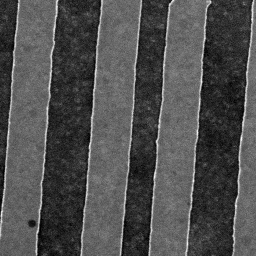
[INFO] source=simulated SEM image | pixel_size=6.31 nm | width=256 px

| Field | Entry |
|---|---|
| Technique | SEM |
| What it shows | one or a few lines or trenches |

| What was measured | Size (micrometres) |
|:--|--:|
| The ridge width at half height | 0.248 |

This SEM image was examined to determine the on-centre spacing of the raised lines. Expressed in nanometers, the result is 468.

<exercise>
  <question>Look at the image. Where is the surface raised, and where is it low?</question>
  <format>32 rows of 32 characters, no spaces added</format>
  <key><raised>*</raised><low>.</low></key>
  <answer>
..*****......*****...*****......
..*****......*****...*****......
..*****......****....*****......
..*****.....*****....*****.....*
..*****.....*****....*****.....*
..*****.....*****....****......*
..*****.....*****....****......*
..****......*****....****......*
..****......*****...*****......*
..****......*****...*****......*
.*****......*****...*****......*
.*****......*****...*****......*
.*****......*****...*****......*
.*****......*****...*****......*
.*****.....******...*****......*
.*****.....*****....*****.....**
.*****.....*****....*****.....**
.*****.....*****....*****.....**
.*****.....*****....****......**
.*****.....*****....****......**
.****......*****....****......**
.****......*****...*****......**
.****......*****...*****......**
.****......*****...*****......**
*****......*****...*****......**
*****......*****...*****.....***
*****......*****...*****.....***
*****.....*****....*****.....***
*****.....*****....*****.....***
*****.....*****....*****.....***
*****.....*****....****......***
*****.....*****....****......***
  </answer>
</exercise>